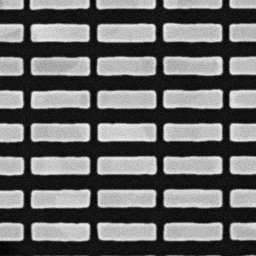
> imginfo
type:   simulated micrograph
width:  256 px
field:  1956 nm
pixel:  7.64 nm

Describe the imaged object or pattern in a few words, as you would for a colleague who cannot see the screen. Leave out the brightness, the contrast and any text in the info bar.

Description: wiring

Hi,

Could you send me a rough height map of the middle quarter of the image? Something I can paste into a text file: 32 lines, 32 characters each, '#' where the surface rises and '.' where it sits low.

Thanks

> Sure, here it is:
######..###############..#######
######..###############..#######
######...##############..#######
................................
................................
................................
................................
######...##############..#######
######...##############..#######
######...##############..#######
######...##############..#######
................................
................................
................................
................................
######...##############..#######
######...##############..#######
######...##############..#######
######...##############..#######
................................
................................
................................
................................
######...##############..#######
######...##############..#######
######...##############..#######
######...##############..#######
................................
................................
................................
................................
.....#....................######